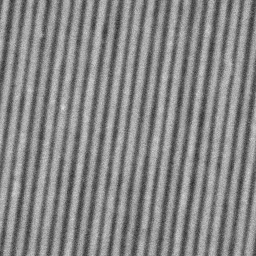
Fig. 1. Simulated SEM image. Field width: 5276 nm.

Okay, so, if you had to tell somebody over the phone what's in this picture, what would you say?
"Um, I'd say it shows parallel lines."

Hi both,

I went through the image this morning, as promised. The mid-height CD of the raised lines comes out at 5.44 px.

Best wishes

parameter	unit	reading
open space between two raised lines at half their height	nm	130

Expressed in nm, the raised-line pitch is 247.